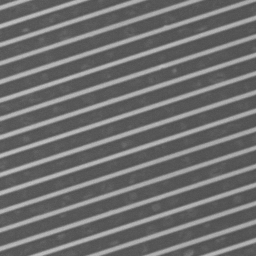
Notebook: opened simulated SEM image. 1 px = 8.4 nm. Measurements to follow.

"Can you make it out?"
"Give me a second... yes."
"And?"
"parallel lines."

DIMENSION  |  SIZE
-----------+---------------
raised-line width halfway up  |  31.9 nm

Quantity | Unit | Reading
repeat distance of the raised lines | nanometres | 148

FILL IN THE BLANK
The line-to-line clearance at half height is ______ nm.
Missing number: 121